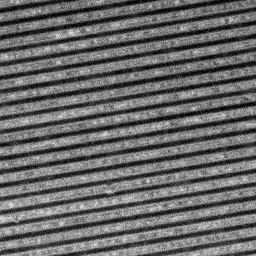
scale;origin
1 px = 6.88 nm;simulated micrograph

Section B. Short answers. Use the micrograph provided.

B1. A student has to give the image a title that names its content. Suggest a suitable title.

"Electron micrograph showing parallel lines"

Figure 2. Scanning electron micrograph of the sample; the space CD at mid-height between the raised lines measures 39.1 nm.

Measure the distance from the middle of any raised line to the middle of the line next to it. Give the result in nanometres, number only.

91.4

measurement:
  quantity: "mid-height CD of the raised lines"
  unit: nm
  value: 51.8